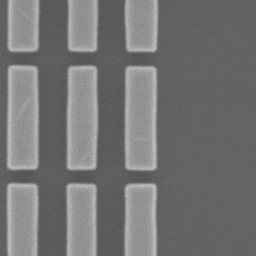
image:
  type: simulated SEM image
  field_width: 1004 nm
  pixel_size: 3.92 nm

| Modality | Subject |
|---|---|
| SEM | wiring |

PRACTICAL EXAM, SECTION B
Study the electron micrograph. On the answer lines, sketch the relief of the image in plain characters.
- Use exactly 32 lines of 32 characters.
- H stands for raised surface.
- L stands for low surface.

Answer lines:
LHHHHLLLLHHHLLLLHHHHLLLLLLLLLLLL
LHHHHLLLLHHHLLLLHHHHLLLLLLLLLLLL
LHHHHLLLLHHHLLLLHHHHLLLLLLLLLLLL
LHHHHLLLLHHHLLLLHHHHLLLLLLLLLLLL
LHHHHLLLLHHHLLLLHHHHLLLLLLLLLLLL
LHHHHLLLLHHHLLLLHHHLLLLLLLLLLLLL
LLLLLLLLLLLLLLLLLLLLLLLLLLLLLLLL
LLLLLLLLLLLLLLLLLLLLLLLLLLLLLLLL
LHHHLLLLLHHHLLLLHHHLLLLLLLLLLLLL
LHHHHLLLLHHHLLLLHHHLLLLLLLLLLLLL
LHHHHLLLLHHHLLLLHHHLLLLLLLLLLLLL
LHHHHLLLLHHHLLLLHHHLLLLLLLLLLLLL
LHHHHLLLLHHHLLLLHHHLLLLLLLLLLLLL
LHHHHLLLHHHHLLLLHHHLLLLLLLLLLLLL
LHHHHLLLHHHHLLLLHHHLLLLLLLLLLLLL
LHHHHLLLHHHHLLLLHHHLLLLLLLLLLLLL
LHHHHLLLHHHHLLLLHHHLLLLLLLLLLLLL
LHHHHLLLHHHHLLLLHHHLLLLLLLLLLLLL
LHHHHLLLHHHHLLLLHHHLLLLLLLLLLLLL
LHHHHLLLHHHHLLLLHHHLLLLLLLLLLLLL
LHHHHLLLHHHHLLLLHHHLLLLLLLLLLLLL
LLLLLLLLLLLLLLLLLLLLLLLLLLLLLLLL
LLLLLLLLLLLLLLLLLLLLLLLLLLLLLLLL
LHHHHLLLHHHHLLLLHHHLLLLLLLLLLLLL
LHHHHLLLHHHHLLLLHHHLLLLLLLLLLLLL
LHHHHLLLHHHHLLLLHHHLLLLLLLLLLLLL
LHHHHLLLHHHHLLLLHHHLLLLLLLLLLLLL
LHHHHLLLHHHHLLLLHHHLLLLLLLLLLLLL
LHHHHLLLHHHHLLLLHHHLLLLLLLLLLLLL
LHHHHLLLHHHHLLLLHHHLLLLLLLLLLLLL
LHHHHLLLHHHHLLLLHHHLLLLLLLLLLLLL
LHHHHLLLHHHHLLLLHHHLLLLLLLLLLLLL